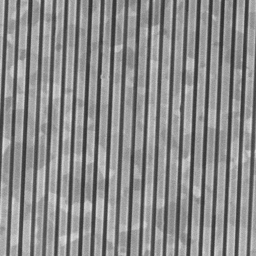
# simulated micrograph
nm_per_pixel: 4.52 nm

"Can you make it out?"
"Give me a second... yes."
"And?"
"parallel lines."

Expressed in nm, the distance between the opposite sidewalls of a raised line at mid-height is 37.2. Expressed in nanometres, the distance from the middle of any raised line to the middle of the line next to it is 54.2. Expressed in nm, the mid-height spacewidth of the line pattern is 20.3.